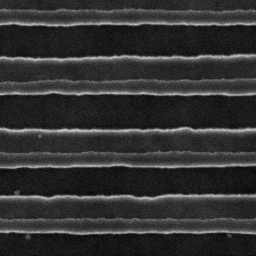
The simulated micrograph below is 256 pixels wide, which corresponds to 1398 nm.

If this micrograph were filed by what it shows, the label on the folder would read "lines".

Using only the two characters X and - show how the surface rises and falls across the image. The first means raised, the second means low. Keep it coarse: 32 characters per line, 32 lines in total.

XXXXXXXXXXXXXXXXXXXXXXXXXXXXXXXX
XXXXXXXXXXXXXXXXXXXXXXXXXXXXXXXX
XXXXXXXXXXXXXXXXXXXXXXXXXXXXXXXX
--------------------------------
--------------------------------
--------------------------------
--------------------------------
XXXXXXXXXXXXXXXXXXXXXXXXXXXXXXXX
XXXXXXXXXXXXXXXXXXXXXXXXXXXXXXXX
XXXXXXXXXXXXXXXXXXXXXXXXXXXXXXXX
XXXXXXXXXXXXXXXXXXXXXXXXXXXXXXXX
XXXXXXXXXXXXXXXXXXXXXXXXXXXXXXXX
--------------------------------
--------------------------------
--------------------------------
--------------------------------
XXXXXXXXXXXXXXXXXXXXXXXXXXXXXXXX
XXXXXXXXXXXXXXXXXXXXXXXXXXXXXXXX
XXXXXXXXXXXXXXXXXXXXXXXXXXXXXXXX
XXXXXXXXXXXXXXXXXXXXXXXXXXXXXXXX
XXXXXXXXXXXXXXXXXXXXXXXXXXXXXXXX
--------------------------------
--------------------------------
--------------------------------
---------------------XXX-XXX-XXX
XXXXXXXXXXXXXXXXXXXXXXXXXXXXXXXX
XXXXXXXXXXXXXXXXXXXXXXXXXXXXXXXX
XXXXXXXXXXXXXXXXXXXXXXXXXXXXXXXX
XXXXXXXXXXXXXXXXXXXXXXXXXXXXXXXX
--------------------------------
--------------------------------
--------------------------------